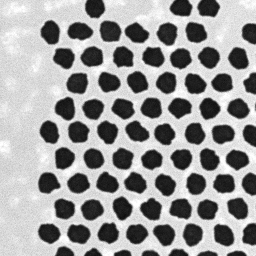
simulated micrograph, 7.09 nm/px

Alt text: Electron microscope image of a regular array of holes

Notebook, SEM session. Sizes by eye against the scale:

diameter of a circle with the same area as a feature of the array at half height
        150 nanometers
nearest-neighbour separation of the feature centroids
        198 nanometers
